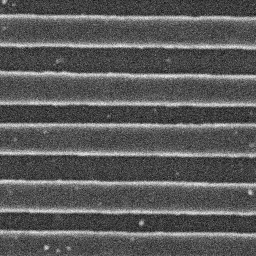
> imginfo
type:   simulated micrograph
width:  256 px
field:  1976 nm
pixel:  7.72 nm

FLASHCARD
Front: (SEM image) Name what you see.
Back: lines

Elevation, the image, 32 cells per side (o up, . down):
................................
................................
oooooooooooooooooooooooooooooooo
oooooooooooooooooooooooooooooooo
oooooooooooooooooooooooooooooooo
oooooooooooooooooooooooooooooooo
................................
................................
................................
ooooooooooooooooooooooooooooo.oo
oooooooooooooooooooooooooooooooo
oooooooooooooooooooooooooooooooo
oooooooooooooooooooooooooooooooo
................................
................................
................................
oooooooooooooooooooooooooooooooo
oooooooooooooooooooooooooooooooo
oooooooooooooooooooooooooooooooo
................................
................................
................................
................................
oooooooooooooooooooooooooooooooo
oooooooooooooooooooooooooooooooo
oooooooooooooooooooooooooooooooo
.......oo..ooooooooooooooooooooo
................................
................................
oooooooooooooooooooooooooooooooo
oooooooooooooooooooooooooooooooo
oooooooooooooooooooooooooooooooo